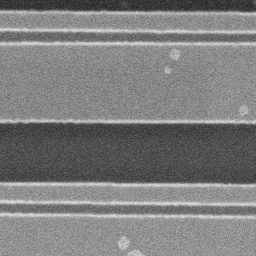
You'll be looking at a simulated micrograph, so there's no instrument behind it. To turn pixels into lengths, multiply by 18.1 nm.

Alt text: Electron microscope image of lines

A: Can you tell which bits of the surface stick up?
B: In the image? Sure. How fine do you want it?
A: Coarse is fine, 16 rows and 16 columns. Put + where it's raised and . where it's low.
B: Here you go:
................
++++++++++++++++
++++++++++++++++
++++++++++++++++
++++++++++++++++
++++++++++++++++
++++++++++++++++
++++++++++++++++
................
................
................
................
++++++++++++++++
++++++++++++++++
++++++++++++++++
++++++++++++++++